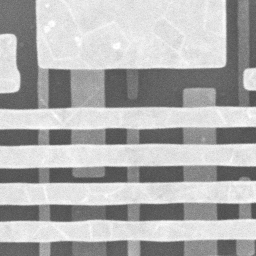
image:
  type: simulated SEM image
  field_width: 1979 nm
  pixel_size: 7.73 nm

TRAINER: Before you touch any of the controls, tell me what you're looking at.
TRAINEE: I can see wiring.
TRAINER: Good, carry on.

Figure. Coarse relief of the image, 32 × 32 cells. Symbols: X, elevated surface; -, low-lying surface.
-----XXXXXXXXXXXXXXXXXXXXXXX----
-----XXXXXXXXXXXXXXXXXXXXXXX----
-----XXXXXXXXXXXXXXXXXXXXXXX----
-----XXXXXXXXXXXXXXXXXXXXXXX----
XX---XXXXXXXXXXXXXXXXXXXXXXX----
XX---XXXXXXXXXXXXXXXXXXXXXXX----
XX---XXXXXXXXXXXXXXXXXXXXXXX----
XX---XXXXXXXXXXXXXXXXXXXXXXX----
XX----XXXXXXXXX-----------------
XX-----------------------------X
XX-----------------------------X
XX------------------------------
--------------------------------
-------------------------XXXXXXX
XXXXXXXXXXXXXXXXXXXXXXXXXXXXXXXX
XXXXXXXXXXXXXXXXXXXXXXXXXXXXXXXX
--------------------------------
--------------------------------
XXXXXXXXXXXXXXXXXXXXXXXXXXXXXXXX
XXXXXXXXXXXXXXXXXXXXXXXXXXXXXXXX
XXXXXXXXXXXXXXXXXXXXXXXXXXXXXXXX
--------------------------------
--------------------------------
XXXXXXXXXXXXXXXXXXXXXXXXXXXXXXXX
XXXXXXXXXXXXXXXXXXXXXXXXXXXXXXXX
XXXXXXXXXXXXXXXX----------------
--------------------------------
--------------------------------
XXXXXXXXXXXXXXXXXXXXXXXXXXXXXXXX
XXXXXXXXXXXXXXXXXXXXXXXXXXXXXXXX
--------------------------------
--------------------------------